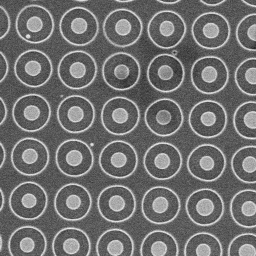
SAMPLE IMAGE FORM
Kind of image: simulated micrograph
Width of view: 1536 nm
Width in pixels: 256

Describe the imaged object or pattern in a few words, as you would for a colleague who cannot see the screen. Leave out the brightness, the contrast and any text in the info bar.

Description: an array of small figures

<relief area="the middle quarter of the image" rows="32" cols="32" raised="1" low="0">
00000000110000000001100000000111
00000000110000000001100000000011
00000000110000000001100000000011
00000001110000000011100000000011
00000001111000000011110000000111
10000111111100000111110000000111
11111111111111111111111100011111
11111111111111111111111111111111
10000111111110011111111111111111
00000011111000000111111000011111
00000001110000000011110000001111
00000001110000000011100000000111
00000001110000000001000000000111
00000001110000000001000000000010
00000001110000000011100000000111
00000011110000000011100000000111
10000111111000000111110000001111
11111111111111111111111100111111
11111111111111111111111111111111
00001111111110011111111111111111
00000011111000000111110000011111
00000011110000000111100000001111
00000001100000000011100000000111
00000001100000000011000000000110
00000001100000000011000000000110
00000001100000000011000000000110
00000011110000000111100000001110
10000111111000000111110000001111
11111111111111111111111000111111
11111111111111111111111111111111
00001111111111111111111111111111
00000111110000001111110000111111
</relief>